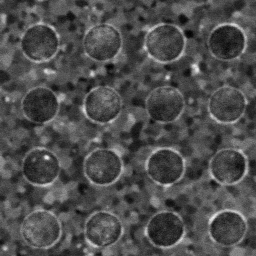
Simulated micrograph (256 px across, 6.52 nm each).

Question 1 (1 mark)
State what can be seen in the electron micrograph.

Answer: a regular array of holes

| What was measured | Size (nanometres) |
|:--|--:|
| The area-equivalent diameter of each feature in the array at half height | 234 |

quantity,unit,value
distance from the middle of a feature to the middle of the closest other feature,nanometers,403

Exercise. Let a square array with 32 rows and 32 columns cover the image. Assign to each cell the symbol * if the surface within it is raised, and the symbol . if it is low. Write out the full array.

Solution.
********************************
********************************
********************************
****..*****...*****...*****...**
***....****....***.....***.....*
***....****....***.....***.....*
***....****....****....***....**
****.*******.*******..**********
********************************
********************************
********************************
****...****...*****...*****...**
***....****....***.....***.....*
***....****....***.....***.....*
***....****....****...*****...**
********************************
********************************
********************************
********************************
***....****....****...*****...**
***....****....***.....***.....*
***....****....***.....***.....*
****...****...*****...*****...**
********************************
********************************
********************************
****..******.***************.***
***....****....****....****...**
***....****....***.....***.....*
***....****....****....***....**
****...*****..*****...*****..***
********************************